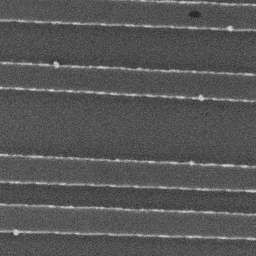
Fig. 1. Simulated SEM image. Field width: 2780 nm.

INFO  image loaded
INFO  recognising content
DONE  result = lines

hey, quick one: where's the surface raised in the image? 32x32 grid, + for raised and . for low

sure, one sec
++++++++++++++++++++++++++++++..
++++++++++++++++++++++++++++++++
++++++++++++++++++++++++++++++++
.......................+++++++++
................................
................................
................................
................................
++++++++++++++..................
++++++++++++++++++++++++++++++++
++++++++++++++++++++++++++++++++
...........+++++++++++++++++++++
............................++++
................................
................................
................................
................................
................................
................................
+++.............................
+++++++++++++++++++++++++.......
++++++++++++++++++++++++++++++++
++++++++++++++++++++++++++++++++
......................++++++++++
................................
................................
+++++++++++++++++++++++++.......
++++++++++++++++++++++++++++++++
++++++++++++++++++++++++++++++++
....................++++++++++++
................................
................................